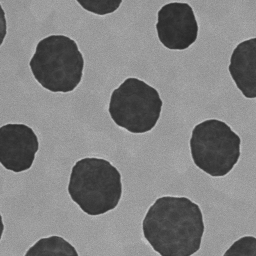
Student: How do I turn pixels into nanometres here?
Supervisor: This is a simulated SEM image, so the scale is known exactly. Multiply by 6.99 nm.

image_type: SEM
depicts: holes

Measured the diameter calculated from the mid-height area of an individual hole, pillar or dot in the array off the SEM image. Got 0.37 µm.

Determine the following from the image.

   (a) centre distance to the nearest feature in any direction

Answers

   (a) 625 nm